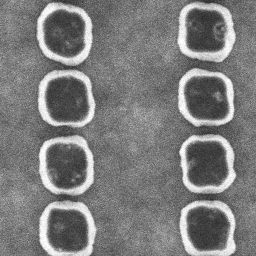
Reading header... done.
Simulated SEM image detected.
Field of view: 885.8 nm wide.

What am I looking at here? raised bodies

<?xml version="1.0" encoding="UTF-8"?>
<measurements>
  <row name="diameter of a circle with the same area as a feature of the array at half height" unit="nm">190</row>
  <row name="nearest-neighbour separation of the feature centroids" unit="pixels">65.9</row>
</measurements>